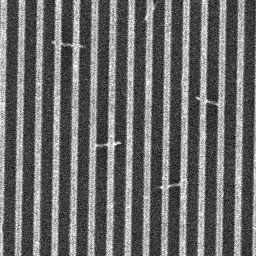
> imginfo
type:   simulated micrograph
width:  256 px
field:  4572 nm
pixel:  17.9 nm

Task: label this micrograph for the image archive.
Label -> parallel lines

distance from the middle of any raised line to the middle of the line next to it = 326 nanometres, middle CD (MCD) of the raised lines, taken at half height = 0.103 microns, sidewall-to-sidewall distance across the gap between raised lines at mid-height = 219 nanometers